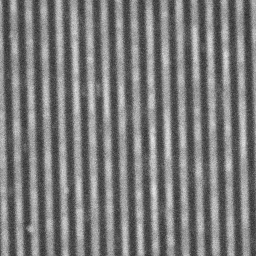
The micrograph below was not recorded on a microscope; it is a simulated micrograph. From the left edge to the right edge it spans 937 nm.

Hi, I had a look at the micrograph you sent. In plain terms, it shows parallel lines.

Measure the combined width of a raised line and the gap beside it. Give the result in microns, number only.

0.0552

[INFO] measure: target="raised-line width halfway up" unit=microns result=0.0238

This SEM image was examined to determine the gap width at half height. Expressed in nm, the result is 33.9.